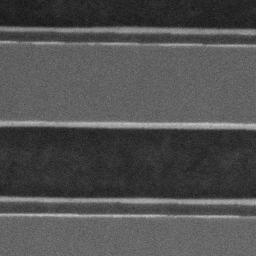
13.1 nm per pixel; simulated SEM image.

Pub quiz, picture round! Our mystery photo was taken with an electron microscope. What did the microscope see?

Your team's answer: lines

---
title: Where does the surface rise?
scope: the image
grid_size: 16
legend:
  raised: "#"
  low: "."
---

................
................
################
################
################
################
################
################
................
................
................
................
................
################
################
################